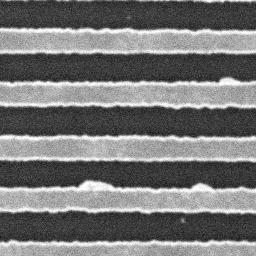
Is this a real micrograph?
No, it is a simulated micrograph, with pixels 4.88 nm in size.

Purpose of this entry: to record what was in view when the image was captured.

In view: lines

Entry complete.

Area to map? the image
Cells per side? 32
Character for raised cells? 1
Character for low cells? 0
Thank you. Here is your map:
00000000000000000000000000000000
00000000000000000000000000000000
00000000000000000000000000000000
00000000000000000000000000000000
11111111111111111111111111111111
11111111111111111111111111111111
11111111111101111001111111101111
00000000000000000000000000000000
00000000000000000000000000000000
00000000000000000000000000000000
11111111111111111111111111111111
11111111111111111111111111111111
11111111111111111111111111111111
00000000000000000000000000100000
00000000000000000000000000000000
00000000000000000000000000000000
00000000000000000000000000000000
11111111111111111111111111111111
11111111111111111111111111111111
11111111111111111111111111111111
00000000000000000000000000000000
00000000000000000000000000000000
00000000000000000000000000000000
00000001111110000000000000000000
11111111111111111111111111111111
11111111111111111111111111111111
00000000000000000010000000001010
00000000000000000000000000000000
00000000000000000000000000000000
00000000000000000000000000000000
11111111111111111111111111111111
11111111111111111111111111111111